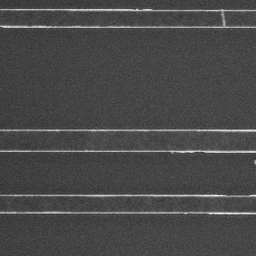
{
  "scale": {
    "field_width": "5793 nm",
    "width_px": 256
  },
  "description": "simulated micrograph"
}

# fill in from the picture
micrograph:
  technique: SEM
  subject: lines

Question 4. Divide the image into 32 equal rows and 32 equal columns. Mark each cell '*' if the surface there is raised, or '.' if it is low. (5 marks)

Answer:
................................
********************************
********************************
................................
................................
................................
................................
................................
................................
................................
................................
................................
................................
................................
................................
................................
********************************
********************************
********************************
................................
................................
................................
................................
................................
****************************...*
********************************
********************************
................................
................................
................................
................................
................................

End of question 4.